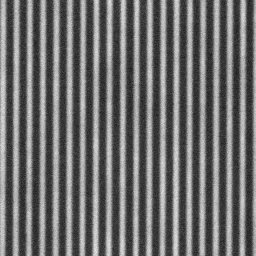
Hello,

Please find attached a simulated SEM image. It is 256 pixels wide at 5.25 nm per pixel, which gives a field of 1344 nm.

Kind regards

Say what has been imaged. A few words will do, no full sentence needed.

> parallel lines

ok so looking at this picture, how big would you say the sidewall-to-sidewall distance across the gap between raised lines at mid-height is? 45.9 nanometers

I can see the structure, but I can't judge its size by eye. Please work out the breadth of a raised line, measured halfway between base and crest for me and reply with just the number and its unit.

0.0203 micrometres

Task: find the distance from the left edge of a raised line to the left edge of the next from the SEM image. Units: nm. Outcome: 69.9